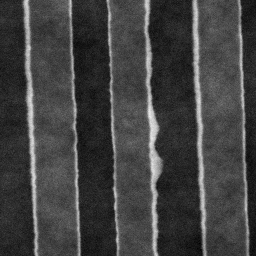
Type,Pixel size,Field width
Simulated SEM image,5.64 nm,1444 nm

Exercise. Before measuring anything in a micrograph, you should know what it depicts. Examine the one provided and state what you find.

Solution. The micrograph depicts lines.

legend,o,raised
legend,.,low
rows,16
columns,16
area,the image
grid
..oo...oo...ooo.
..oo...oo...ooo.
..ooo..oo...ooo.
..ooo..oo...ooo.
..ooo..oo...ooo.
..ooo..oo...ooo.
..ooo..oo...ooo.
..ooo..oo....oo.
..ooo..ooo...oo.
..ooo..ooo...oo.
..ooo..ooo...oo.
..ooo..ooo...oo.
..ooo..ooo...oo.
..ooo..ooo...oo.
..ooo..ooo...ooo
..ooo..ooo...ooo